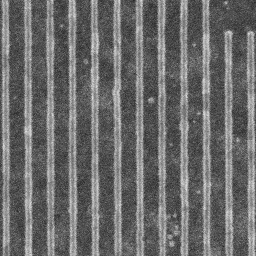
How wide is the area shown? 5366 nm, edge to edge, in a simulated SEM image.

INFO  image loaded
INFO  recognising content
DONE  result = parallel lines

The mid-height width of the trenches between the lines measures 17 pixels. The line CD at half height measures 107 nm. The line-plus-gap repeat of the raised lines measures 0.467 µm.